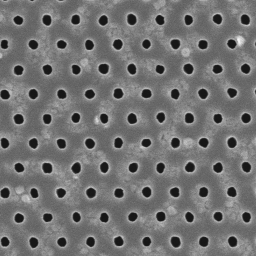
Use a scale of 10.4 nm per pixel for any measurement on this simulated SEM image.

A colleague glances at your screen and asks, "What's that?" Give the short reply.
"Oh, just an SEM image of a regular array of holes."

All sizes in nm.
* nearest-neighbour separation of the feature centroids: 291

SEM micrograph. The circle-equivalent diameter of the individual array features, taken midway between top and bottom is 99.3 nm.